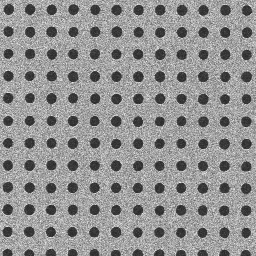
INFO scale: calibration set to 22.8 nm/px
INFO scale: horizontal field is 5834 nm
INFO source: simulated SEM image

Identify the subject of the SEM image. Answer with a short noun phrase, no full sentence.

a regular array of holes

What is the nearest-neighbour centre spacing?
486 nm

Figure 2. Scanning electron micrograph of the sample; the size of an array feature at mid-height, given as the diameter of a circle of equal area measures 241 nanometres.